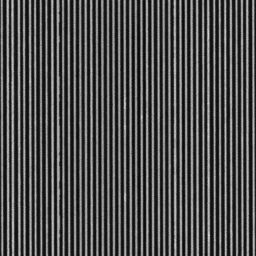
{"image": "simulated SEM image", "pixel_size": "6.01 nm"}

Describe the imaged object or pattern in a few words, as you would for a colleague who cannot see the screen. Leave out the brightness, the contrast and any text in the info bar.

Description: parallel lines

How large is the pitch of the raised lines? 33.6 nm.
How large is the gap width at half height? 0.0218 microns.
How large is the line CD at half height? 11.3 nm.